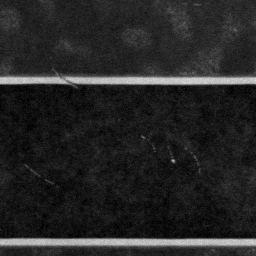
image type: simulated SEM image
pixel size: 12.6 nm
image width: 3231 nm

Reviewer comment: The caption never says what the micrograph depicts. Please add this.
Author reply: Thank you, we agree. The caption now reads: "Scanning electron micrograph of one or a few lines or trenches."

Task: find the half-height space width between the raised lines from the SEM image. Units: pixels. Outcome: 161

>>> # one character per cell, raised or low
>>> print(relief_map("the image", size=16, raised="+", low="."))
++++++++++++++++
++++++++++++++++
++++++++++++++++
++++++++++++++++
++++++++++++++++
................
................
................
................
................
................
................
................
................
................
++++++++++++++++